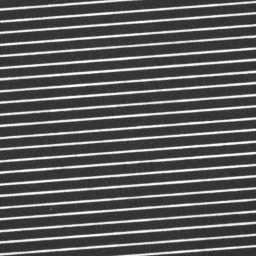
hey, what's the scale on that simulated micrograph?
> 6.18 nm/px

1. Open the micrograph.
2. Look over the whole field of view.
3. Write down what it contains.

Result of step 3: parallel lines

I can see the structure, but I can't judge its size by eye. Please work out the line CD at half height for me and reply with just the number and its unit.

6.9 nanometres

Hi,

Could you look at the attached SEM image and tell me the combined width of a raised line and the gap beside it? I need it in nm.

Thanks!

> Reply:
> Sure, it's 71.7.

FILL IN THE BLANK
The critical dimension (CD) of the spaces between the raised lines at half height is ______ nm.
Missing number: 64.7